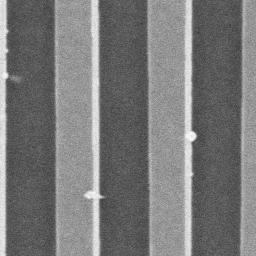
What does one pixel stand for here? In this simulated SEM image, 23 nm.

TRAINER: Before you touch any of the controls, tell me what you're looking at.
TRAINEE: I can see lines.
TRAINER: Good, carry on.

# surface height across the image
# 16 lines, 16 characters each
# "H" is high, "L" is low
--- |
LLLHHHLLLHHHLLLH
LLLHHHLLLHHHLLLH
LLLHHHLLLHHHLLLH
LLLHHHLLLHHHLLLH
LLLLHHLLLHHHLLLH
LLLLHHLLLHHHLLLH
LLLLHHLLLHHHLLLH
LLLLHHLLLHHHLLLH
LLLLHHLLLHHHLLLH
LLLLHHLLLHHHLLLH
LLLLHHLLLHHHLLLH
LLLLHHLLLHHHLLLH
LLLLHHLLLHHHLLLH
LLLLHHLLLHHHLLLH
LLLLHHLLLHHHLLLH
LLLLHHLLLHHHLLLH